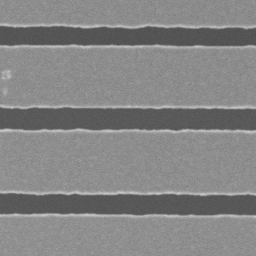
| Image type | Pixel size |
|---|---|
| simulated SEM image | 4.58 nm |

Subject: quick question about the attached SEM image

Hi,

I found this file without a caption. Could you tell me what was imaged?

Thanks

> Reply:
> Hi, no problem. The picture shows lines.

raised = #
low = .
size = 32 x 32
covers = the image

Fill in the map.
################################
################################
################################
................................
................................
................................
################################
################################
################################
################################
################################
################################
################################
.###..#..........####.##########
................................
................................
################################
################################
################################
################################
################################
################################
################################
################################
................................
................................
................................
################################
################################
################################
################################
################################